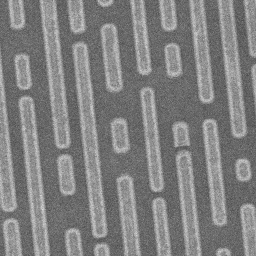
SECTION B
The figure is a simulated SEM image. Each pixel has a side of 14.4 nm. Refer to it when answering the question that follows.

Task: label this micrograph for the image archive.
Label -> parallel lines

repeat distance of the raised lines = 428 nanometers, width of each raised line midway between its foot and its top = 157 nm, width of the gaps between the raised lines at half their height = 266 nanometers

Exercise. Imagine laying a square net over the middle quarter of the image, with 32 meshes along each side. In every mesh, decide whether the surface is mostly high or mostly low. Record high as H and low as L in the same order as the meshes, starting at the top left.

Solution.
LLLHHHLLLLLHHHLLLLLHHLLLLLHHHLLL
LLLHHHLLLLLHHHLLLLLHHLLLLLHHHLLL
LLLLHHLLLLLHHHLLLLLLLLLLLLLLLLLL
LLLLHHLLLLLHHHLLLLLLLLLLLLLLLLLL
LLLLHHLLLLLHHHLLLLLLLLLLLLLLLLLL
LLLLHHLLLLLHHHLLLLLLLLLLLLLLLLLL
LLLLHHLLLLLLLLLLLLLLLLLLLLLLLLLL
LLLLHHHLLLLLLLLLLLLLHHLLLLLLLLLL
LLLLHHHLLLLLLLLLLLLLHHLLLLLLLLLL
LLLLHHHLLLLLLLLLLLLLHHLLLLLLLLLL
LLLLHHHLLLLLLLLLLLLLHHLLLLLLLLLL
LLLLLHHLLLLLLLLLLLLLHHLLLLLLLLLL
LLLLLHHLLLLLLLLLLLLLHHLLLLLLLLLL
HLLLLHHLLLLLLLLLLLLLHHLLLLLLLLLL
HLLLLHHLLLLLLLLLLLLLLHHLLLLLLLLL
HLLLLHHLLLLLHHHLLLLLLHHLLLLLLLLL
HLLLLHHLLLLLHHHLLLLLLHHLLLLLHHLL
HLLLLHHHLLLLLHHHLLLLLHHLLLLLHHHL
HLLLLHHHLLLLLHHHLLLLLHHLLLLLHHHL
HLLLLHHHLLLLLHHLLLLLLHHLLLLLHHHL
LLLLLLHHLLLLLHHHLLLLLHHLLLLLLLLL
LLLLLHHHLLLLLLLLLLLLLHHLLLLLLLLL
LLLLLLHHLLLLLLLLLLLLLHHLLLLLLLLL
HLLLLLHHLLLLLLLLLLLLLLHLLLLLLHHL
HHLLLLHHLLLLLLLLLLLLLLHHLLLLLHHL
HHLLLLHHLLLLLLLLLLLLLLHHLLLLLHHH
HHLLLLHHHLLLLLLLLLLLLLHHLLLLLHHL
HHLLLLHHHLLLLLLLLLLLLLHHLLLLLHHH
HHLLLLHHHLLLLLLLLLLLLLHHLLLLLHHH
HHLLLLHHHLLLLLHHHLLLLLHHLLLLLHHH
HHLLLLLHHLLLLLHHHLLLLLHHLLLLLHHH
HHLLLLLHHLLLLLHHHLLLLLLLLLLLLLHH